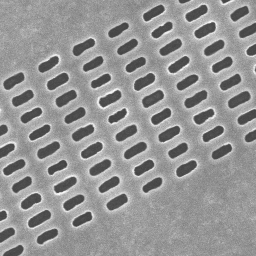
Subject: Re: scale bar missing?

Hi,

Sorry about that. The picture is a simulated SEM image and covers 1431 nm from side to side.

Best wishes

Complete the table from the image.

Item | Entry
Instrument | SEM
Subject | a regular array of holes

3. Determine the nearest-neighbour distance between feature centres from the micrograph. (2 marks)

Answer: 107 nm